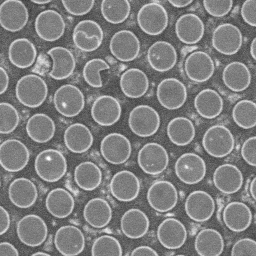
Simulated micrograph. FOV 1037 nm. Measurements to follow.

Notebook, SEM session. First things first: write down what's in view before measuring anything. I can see a regular array of raised bodies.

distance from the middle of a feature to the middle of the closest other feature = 156 nm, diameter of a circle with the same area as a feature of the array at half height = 0.117 micrometres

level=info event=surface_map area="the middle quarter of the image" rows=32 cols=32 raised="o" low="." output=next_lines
ooo..oooooo...........ooooo...oo
oo...oooo.......ooo.....o.....oo
oo...oooo......ooooo...........o
.....oooo.....ooooooo..........o
......ooo.....ooooooo....oooo...
oo.....oo.....ooooooo...oooooo..
oooo...........ooooo...ooooooo..
oooo...........ooooo...ooooooo..
ooooo....ooo............oooooo..
ooooo...ooooo...........oooooo..
ooooo..ooooooo...........oooo...
oooo...ooooooo...ooooo..........
ooo....ooooooo...oooooo.........
.......ooooooo..oooooooo....o...
........ooooo...oooooooo...ooooo
..ooo...........oooooooo..oooooo
.ooooo...........oooooo...oooooo
ooooooo...........oooo....oooooo
ooooooo...ooooo............ooooo
ooooooo...oooooo...........oooo.
.ooooo...ooooooo....oooo........
..ooo....ooooooo...oooooo.......
..........oooooo...ooooooo......
..........oooooo...ooooooo...ooo
...........oooo....ooooooo..oooo
...ooooo...........ooooooo..oooo
...oooooo...........ooooo...oooo
...oooooo....oooo...........oooo
...oooooo...oooooo...........ooo
...oooooo...ooooooo.....o.....oo
....oooo....ooooooo...ooooo.....
............ooooooo..ooooooo....